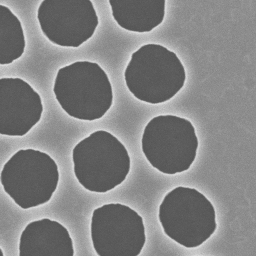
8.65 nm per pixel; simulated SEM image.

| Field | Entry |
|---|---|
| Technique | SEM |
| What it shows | holes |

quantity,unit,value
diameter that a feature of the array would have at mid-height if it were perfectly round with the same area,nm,505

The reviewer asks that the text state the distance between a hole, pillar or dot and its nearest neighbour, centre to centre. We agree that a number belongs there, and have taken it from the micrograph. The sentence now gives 0.618 µm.